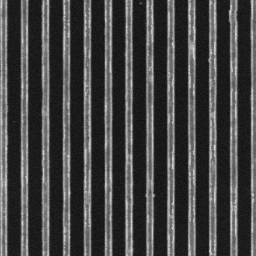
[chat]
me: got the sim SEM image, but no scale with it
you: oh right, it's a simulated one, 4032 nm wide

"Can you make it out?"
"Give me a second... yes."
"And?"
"parallel lines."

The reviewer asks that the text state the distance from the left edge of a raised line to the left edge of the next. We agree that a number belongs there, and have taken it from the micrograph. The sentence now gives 0.33 microns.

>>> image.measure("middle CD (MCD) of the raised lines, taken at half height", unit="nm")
96.5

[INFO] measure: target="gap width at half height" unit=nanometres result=234